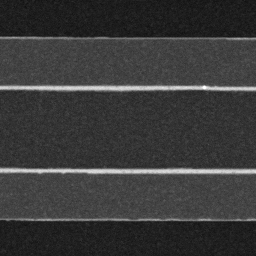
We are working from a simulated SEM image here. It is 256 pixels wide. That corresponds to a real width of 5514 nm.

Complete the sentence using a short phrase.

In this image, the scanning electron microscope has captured lines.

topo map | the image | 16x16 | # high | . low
................
................
################
################
################
............#...
................
................
................
................
................
################
################
################
................
................